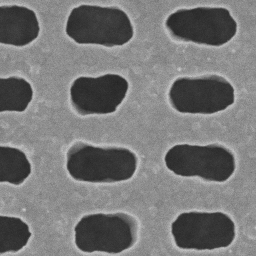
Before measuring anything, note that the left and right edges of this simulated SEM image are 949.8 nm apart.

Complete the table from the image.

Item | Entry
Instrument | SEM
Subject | a regular array of holes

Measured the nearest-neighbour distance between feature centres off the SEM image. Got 254 nanometers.